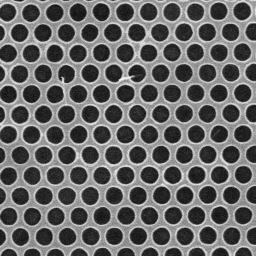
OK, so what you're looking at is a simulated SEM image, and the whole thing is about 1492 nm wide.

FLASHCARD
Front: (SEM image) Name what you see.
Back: a regular array of holes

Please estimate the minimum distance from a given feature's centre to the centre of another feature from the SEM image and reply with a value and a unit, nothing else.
134 nanometres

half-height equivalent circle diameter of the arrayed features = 106 nanometers